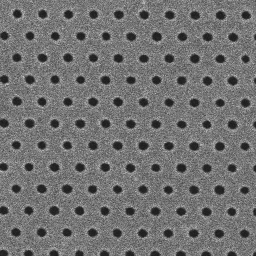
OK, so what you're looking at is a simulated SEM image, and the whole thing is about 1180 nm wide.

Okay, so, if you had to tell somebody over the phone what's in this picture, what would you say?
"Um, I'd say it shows a regular array of holes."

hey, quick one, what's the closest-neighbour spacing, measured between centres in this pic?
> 114 nm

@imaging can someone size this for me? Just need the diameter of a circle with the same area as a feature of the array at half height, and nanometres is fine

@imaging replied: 40.9